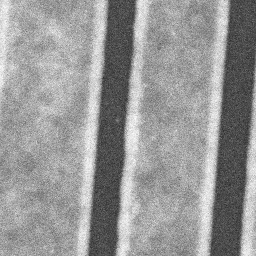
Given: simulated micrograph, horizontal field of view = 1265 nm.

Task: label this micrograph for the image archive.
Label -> one or a few lines or trenches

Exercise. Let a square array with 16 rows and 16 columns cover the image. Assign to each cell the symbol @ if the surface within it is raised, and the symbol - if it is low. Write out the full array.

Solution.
@@@@@@---@@@@@--
@@@@@@---@@@@@--
@@@@@@---@@@@@--
@@@@@@---@@@@@--
@@@@@@---@@@@@--
@@@@@@--@@@@@@--
@@@@@@--@@@@@---
@@@@@@--@@@@@---
@@@@@@--@@@@@---
@@@@@@--@@@@@---
@@@@@@--@@@@@---
@@@@@---@@@@@---
@@@@@---@@@@@---
@@@@@---@@@@@---
@@@@@---@@@@@---
@@@@@---@@@@@--@